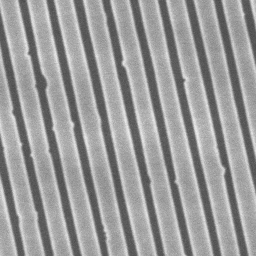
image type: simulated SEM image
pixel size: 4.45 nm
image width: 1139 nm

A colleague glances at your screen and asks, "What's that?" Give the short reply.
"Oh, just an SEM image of parallel lines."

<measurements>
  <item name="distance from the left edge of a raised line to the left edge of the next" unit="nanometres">122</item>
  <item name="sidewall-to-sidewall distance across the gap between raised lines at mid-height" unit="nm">39.7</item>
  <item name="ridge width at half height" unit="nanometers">78.9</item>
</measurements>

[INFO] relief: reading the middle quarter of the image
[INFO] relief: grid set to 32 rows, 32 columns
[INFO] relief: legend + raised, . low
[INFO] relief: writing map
.+++++...++++..+++++..++++...+++
.+++++...++++...++++...++++..+++
..++++...++++...++++...++++...++
..+++++..++++...+++++..++++...++
..+++++..+++++..+++++..+++++..++
..+++++...++++...++++..+++++..++
...++++...++++...++++...++++..++
...++++...++++...++++...++++...+
...+++++..++++...++++...++++...+
+..+++++..+++++..+++++..+++++..+
+..+++++...++++...++++..+++++..+
+...++++...++++...++++...++++...
+...+++++..++++...++++...++++...
++..+++++..+++++..+++++..+++++..
++..+++++..+++++...++++..+++++..
++...++++...++++...++++...++++..
++...++++...++++...++++...++++..
++...++++...++++...++++...++++..
+++..+++++..+++++..+++++..+++++.
+++..+++++..+++++...++++..+++++.
+++...++++...++++...++++...++++.
+++...++++...++++...++++...++++.
+++...+++++..+++++..++++...+++++
++++..+++++..+++++..+++++..+++++
++++..+++++..+++++..+++++..+++++
++++...++++...++++...++++..+++++
++++...+++++..+++++..+++++..++++
+++++..+++++..+++++..+++++..++++
+++++..+++++..+++++...++++..++++
+++++...++++..+++++...++++..++++
.++++...++++...++++...++++...+++
.++++...+++++..+++++..+++++..+++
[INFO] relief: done